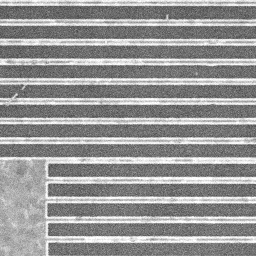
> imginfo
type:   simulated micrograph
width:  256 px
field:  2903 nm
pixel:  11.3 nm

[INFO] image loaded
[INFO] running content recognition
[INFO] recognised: parallel lines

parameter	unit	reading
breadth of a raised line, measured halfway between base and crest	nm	51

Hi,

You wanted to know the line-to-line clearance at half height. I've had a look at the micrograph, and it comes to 172 nanometers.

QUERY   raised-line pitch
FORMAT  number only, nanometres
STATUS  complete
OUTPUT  224